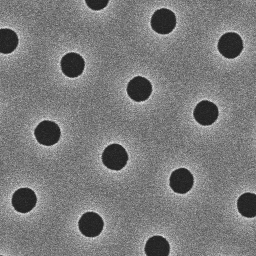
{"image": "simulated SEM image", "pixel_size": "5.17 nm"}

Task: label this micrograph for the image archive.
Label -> a regular array of holes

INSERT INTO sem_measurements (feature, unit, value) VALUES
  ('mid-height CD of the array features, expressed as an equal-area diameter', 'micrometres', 0.134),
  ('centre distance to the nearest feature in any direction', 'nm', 367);